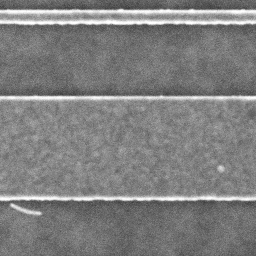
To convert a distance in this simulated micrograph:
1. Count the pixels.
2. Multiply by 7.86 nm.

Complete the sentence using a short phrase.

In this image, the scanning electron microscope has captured lines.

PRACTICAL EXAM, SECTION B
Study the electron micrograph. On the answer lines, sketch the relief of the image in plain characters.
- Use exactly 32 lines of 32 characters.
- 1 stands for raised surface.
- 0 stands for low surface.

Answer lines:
00000000000000000000000000000000
11111111111111111111111111111111
11111111111111111111111111111111
00000000000000000000000000000000
00000000000000000000000000000000
00000000000000000000000000000000
00000000000000000000000000000000
00000000000000000000000000000000
00000000000000000000000000000000
00000000000000000000000000000000
00000000000000000000000000000000
00000000000000000000000000000000
11111111111111111111111111111111
11111111111111111111111111111111
11111111111111111111111111111111
11111111111111111111111111111111
11111111111111111111111111111111
11111111111111111111111111111111
11111111111111111111111111111111
11111111111111111111111111111111
11111111111111111111111111111111
11111111111111111111111111111111
11111111111111111111111111111111
11111111111111111111111111111111
11111111111111111111111111111111
00000000000000000000000000000000
00000000000000000000000000000000
00000000000000000000000000000000
00000000000000000000000000000000
00000000000000000000000000000000
00000000000000000000000000000000
00000000000000000000000000000000